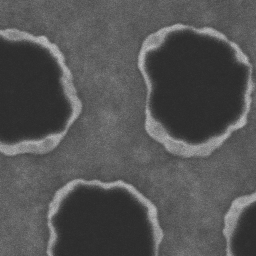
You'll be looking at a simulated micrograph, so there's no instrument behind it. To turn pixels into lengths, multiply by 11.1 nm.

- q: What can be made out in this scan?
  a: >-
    raised bodies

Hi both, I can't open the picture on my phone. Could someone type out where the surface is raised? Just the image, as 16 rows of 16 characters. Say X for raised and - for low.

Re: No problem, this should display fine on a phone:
----------------
----------------
XXX-------XXXX--
XXXX-----XXXXXX-
XXXX-----XXXXXXX
XXXX-----XXXXXXX
XXXXX----XXXXXXX
XXXX-----XXXXXX-
XXXX------XXXX--
----------------
----------------
----XXXX--------
----XXXXX-------
---XXXXXXX----XX
---XXXXXXX----XX
---XXXXXXX----XX